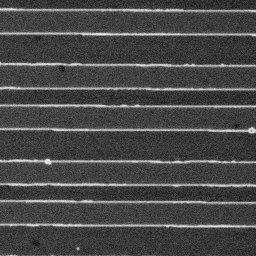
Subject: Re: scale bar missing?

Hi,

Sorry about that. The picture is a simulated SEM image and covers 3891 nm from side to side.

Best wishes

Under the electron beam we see lines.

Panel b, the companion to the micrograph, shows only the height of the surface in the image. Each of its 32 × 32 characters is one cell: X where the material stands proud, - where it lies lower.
--------------------------------
XXXXXXXXXXXXXXXXXXXXXXXXXXXXXXXX
XXXXXXXXXXXXXXXXXXXXXXXXXXXXXXXX
XXXXXXXXXXXXXXXXXXXXXXXXXXXXXXXX
--------------------------------
--------------------------------
--------------------------------
--------------------------------
XXXXXXXXXXXXXXXXXXXXXXXXXXXXXXXX
XXXXXXXXXXXXXXXXXXXXXXXXXXXXXXXX
XXXXXXXXXXXXXXXXXXXXXXXXXXXXXXXX
--------------------------------
--------------------------------
XXXXXXXXXXXXXXXXXXXXXXXXXXXXXXXX
XXXXXXXXXXXXXXXXXXXXXXXXXXXXXXXX
XXXXXXXXXXXXXXXXXXXXXXXXXXXXXXXX
-------------------------------X
--------------------------------
--------------------------------
--------------------------------
XXXXXXXXXXXXXXXXXXXXXXXXXXXXXXXX
XXXXXXXXXXXXXXXXXXXXXXXXXXXXXXXX
XXXXXXXXXXXXXXXXXXXXXXXXXXXXXXXX
--------------------------------
--------------------------------
XXXXXXXXXXXXXXXXXXXXXXXXXXXXXXXX
XXXXXXXXXXXXXXXXXXXXXXXXXXXXXXXX
XXXXXXXXXXXXXXXXXXXXXXXXXXXXXXXX
--------------------------------
--------------------------------
--------------------------------
--------------------------------